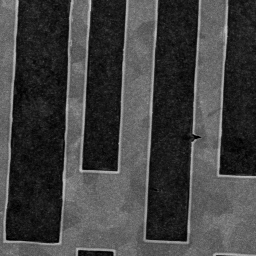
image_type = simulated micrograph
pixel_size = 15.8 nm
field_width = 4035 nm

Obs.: one or a few lines or trenches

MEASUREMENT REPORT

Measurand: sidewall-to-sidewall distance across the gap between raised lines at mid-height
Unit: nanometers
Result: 679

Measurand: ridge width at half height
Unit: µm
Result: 0.427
